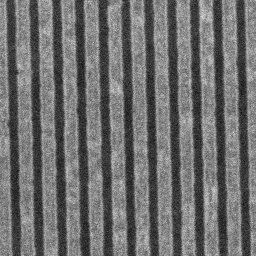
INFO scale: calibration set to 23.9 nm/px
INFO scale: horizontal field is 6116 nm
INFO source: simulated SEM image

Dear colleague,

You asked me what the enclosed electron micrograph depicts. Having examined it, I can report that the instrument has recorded parallel lines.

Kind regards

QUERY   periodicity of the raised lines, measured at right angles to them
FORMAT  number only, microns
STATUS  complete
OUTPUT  0.548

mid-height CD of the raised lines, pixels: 11.6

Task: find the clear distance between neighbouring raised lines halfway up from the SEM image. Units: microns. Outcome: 0.254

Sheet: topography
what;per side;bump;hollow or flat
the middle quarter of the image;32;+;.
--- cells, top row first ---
+++...++....++...+++...+++...++.
+++...+++..+++...+++...+++...++.
+++...+++..+++...+++...+++...+++
+++...+++...++....++...+++...+++
+++...++....++....++...+++...+++
+++...+++...++....++...+++...+++
+++...+++...++....++...+++...+++
+++...+++...++....++...+++...+++
+++...+++...+++...++...+++...+++
+++...+++...+++..+++...+++...+++
+++...+++...+++..+++...+++...+++
+++...+++...+++..+++...+++...+++
+++...+++...+++..+++...+++...+++
+++...+++...+++...++...+++...+++
+++...+++...+++...++...+++...+++
+++...+++...+++...++...+++...+++
+++...+++...+++...++...+++...+++
+++...+++...+++...+++..+++...+++
+++...+++...+++...+++..+++...+++
+++...+++...+++...+++..+++...+++
.++...+++...+++...+++..+++...+++
.++...+++...+++...+++..+++...+++
.++...+++...+++...+++...++...+++
.++...+++...+++...+++...++...+++
+++...+++...+++...+++...++...+++
+++...+++...+++...+++...+++..+++
.++...+++...+++...+++...+++..+++
.++...+++...+++...+++...+++..+++
.++....++...+++...+++...+++..+++
.++....++...+++...+++...+++..+++
.++...+++...+++...+++...+++...++
.++...+++...+++...+++...+++...++